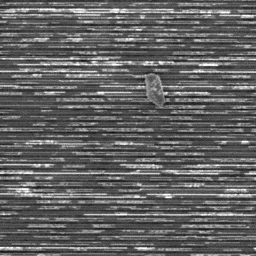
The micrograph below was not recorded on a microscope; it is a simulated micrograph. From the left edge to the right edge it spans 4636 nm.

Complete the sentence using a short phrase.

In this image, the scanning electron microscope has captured parallel lines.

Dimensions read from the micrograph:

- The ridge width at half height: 56.6 nm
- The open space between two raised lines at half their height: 0.0566 microns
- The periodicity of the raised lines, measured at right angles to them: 5.97 pixels